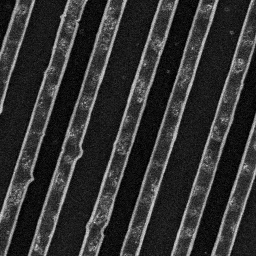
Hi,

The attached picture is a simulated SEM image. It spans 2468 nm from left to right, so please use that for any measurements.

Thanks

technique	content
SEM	parallel lines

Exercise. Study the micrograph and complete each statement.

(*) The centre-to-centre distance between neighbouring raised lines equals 420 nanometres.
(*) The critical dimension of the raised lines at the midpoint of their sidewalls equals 16.3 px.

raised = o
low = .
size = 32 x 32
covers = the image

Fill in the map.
..oo....ooo..ooo....oo...oo....o
..oo....oo...oo.....oo...oo....o
.ooo....oo...oo....oo...oo.....o
.oo....ooo...oo....oo...oo....oo
.oo....oo...oo.....oo...oo....oo
ooo....oo...oo....ooo..oo.....oo
oo.....oo...oo....oo...oo....ooo
oo....oo...oo.....oo...oo....oo.
oo....oo...oo....ooo..ooo....oo.
o.....oo...oo....oo...oo.....oo.
o....oo...oo.....oo...oo....oo..
o....oo...oo....oo....oo....oo..
.....oo...oo....oo...oo.....oo..
....oo...ooo....oo...oo....oo...
....oo...oo....ooo...oo....oo...
....oo...oo....oo...oo.....oo...
...ooo..ooo....oo...oo....oo...o
...oo...oo.....oo...oo....oo...o
...oo...oo....oo...oo.....oo...o
..ooo...oo....oo...oo....oo...oo
..oo...oo.....oo...oo....oo...oo
..oo...oo....oo...oo.....oo...oo
.ooo...oo....oo...oo....ooo...oo
.oo...oo.....oo...oo....oo...oo.
.oo...oo....oo...oo.....oo...oo.
.oo...oo....oo...oo....ooo..ooo.
oo...oo.....oo...oo....oo...oo..
oo...oo....ooo..ooo....oo...oo..
oo...oo....oo...oo.....oo...oo..
o...oo.....oo...oo....oo...oo...
o...oo....ooo..ooo....oo...oo...
o...oo....oo...oo.....oo...oo...